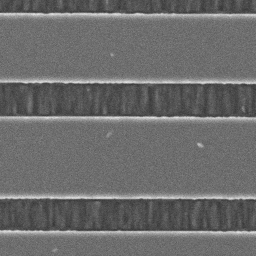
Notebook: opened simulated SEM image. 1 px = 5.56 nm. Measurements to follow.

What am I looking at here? lines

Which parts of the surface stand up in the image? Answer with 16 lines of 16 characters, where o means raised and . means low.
................
oooooooooooooooo
oooooooooooooooo
oooooooooooooooo
oooooooooooooooo
................
................
oooooooooooooooo
oooooooooooooooo
oooooooooooooooo
oooooooooooooooo
oooooooooooooooo
................
................
oooooooooooooooo
oooooooooooooooo